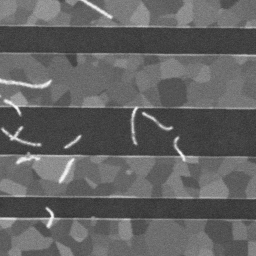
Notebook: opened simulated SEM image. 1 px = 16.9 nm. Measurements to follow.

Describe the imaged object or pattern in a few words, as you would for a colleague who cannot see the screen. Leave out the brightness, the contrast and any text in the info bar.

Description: groups of lines, slits or small figures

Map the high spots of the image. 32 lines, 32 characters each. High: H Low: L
HHHHHHHHHHHHHHHHHHHHHHHHHHHHHHHH
HHHHHHHHHHHHHHHHHHHHHHHHHHHHHHHH
HHHHHHHHHHHHHHHHHHHHHHHHHHHHHHHH
LLLLLLLLLLLLLLLLLLLLLLLLLLLLLLLL
LLLLLLLLLLLLLLLLLLLLLLLLLLLLLLLL
LLLLLLLLLLLLLLLLLLLLLLLLLLLLLLLL
LLLLLLLLLLLLLLLLLLLLLLLLLLLLLLLL
HHHHHHHHHHHHHHHHHHHHHHHHHHHHHHHH
HHHHHHHHHHHHHHHHHHHHHHHHHHHHHHHH
HHHHHHHHHHHHHHHHHHHHHHHHHHHHHHHH
HHHHHHHHHHHHHHHHHHHHHHHHHHHHHHHH
HHHHHHHHHHHHHHHHHHHHHHHHHHHHHHHH
HHHHHHHHHHHHHHHHHHHHHHHHHHHHHHHH
LLLLLLLLLLLLLLLLHHLLLLLLHHHHHHHH
LLLLLLLLLLLLLLLLLLLLLLLLLLLLLLLL
LLLLLLLLLLLLLLLLLLLLLLLLLLLLLLLL
LLLLLLLLLLLLLLLLLLLLLLLLLLLLLLLL
LLLLLLLLLLLLLLLLLLLLLLLLLLLLLLLL
LLLLLLLLLLLLLLLLLLLLLLLLLLLLLLLL
HHHHHHHHHHHHHHLLLLLLLLHLLLLLLLLL
HHHHHHHHHHHHHHHHHHHHHHHHHHHHHHHH
HHHHHHHHHHHHHHHHHHHHHHHHHHHHHHHH
HHHHHHHHHHHHHHHHHHHHHHHHHHHHHHHH
HHHHHHHHHHHHHHHHHHHHHHHHHHHHHHHH
LLLLLLHHHHHHHHHHHHHHHHHHHHHHHHHH
LLLLLLLLLLLLLLLLLLLLLLLLLLLLLLLL
LLLLLLLLLLLLLLLLLLLLLLLLLLLLLLLL
HHHHHHHHHHHHHHLLHHHHHHHLLLLLLLLL
HHHHHHHHHHHHHHHHHHHHHHHHHHHHHHHH
HHHHHHHHHHHHHHHHHHHHHHHHHHHHHHHH
HHHHHHHHHHHHHHHHHHHHHHHHHHHHHHHH
HHHHHHHHHHHHHHHHHHHHHHHHHHHHHHHH